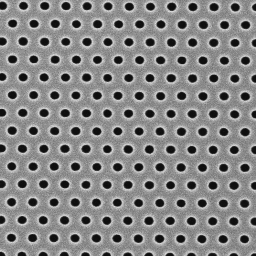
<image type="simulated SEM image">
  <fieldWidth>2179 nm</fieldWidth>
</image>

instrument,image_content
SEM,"a regular array of holes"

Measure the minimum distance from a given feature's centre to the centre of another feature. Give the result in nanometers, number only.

174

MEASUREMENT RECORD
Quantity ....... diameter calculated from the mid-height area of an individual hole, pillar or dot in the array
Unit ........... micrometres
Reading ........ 0.0686